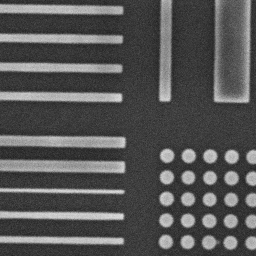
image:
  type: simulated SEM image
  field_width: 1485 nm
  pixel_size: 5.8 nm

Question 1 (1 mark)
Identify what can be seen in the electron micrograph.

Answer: groups of lines, slits or small figures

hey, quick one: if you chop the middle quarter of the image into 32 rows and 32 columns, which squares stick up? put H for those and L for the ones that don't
HHHHHHHHHHHHHHLLLLLLLLLLHHHLLLLL
HHHHHHHHHHHHHHLLLLLLLLLLHHHLLLLL
LLLLLLLLLLLLLLLLLLLLLLLLHHHLLLLL
LLLLLLLLLLLLLLLLLLLLLLLLHHLLLLLL
LLLLLLLLLLLLLLLLLLLLLLLLHHLLLLLL
LLLLLLLLLLLLLLLLLLLLLLLLHHLLLLLL
LLLLLLLLLLLLLLLLLLLLLLLLHHLLLLLL
HHHHHHHHHHHHHHLLLLLLLLLLHHLLLLLL
HHHHHHHHHHHHHHLLLLLLLLLLHHLLLLLL
LLLLLLLLLLLLLLLLLLLLLLLLLLLLLLLL
LLLLLLLLLLLLLLLLLLLLLLLLLLLLLLLL
LLLLLLLLLLLLLLLLLLLLLLLLLLLLLLLL
LLLLLLLLLLLLLLLLLLLLLLLLLLLLLLLL
LLLLLLLLLLLLLLLLLLLLLLLLLLLLLLLL
LLLLLLLLLLLLLLLLLLLLLLLLLLLLLLLL
LLLLLLLLLLLLLLLLLLLLLLLLLLLLLLLL
LLLLLLLLLLLLLLLLLLLLLLLLLLLLLLLL
LLLLLLLLLLLLLLLLLLLLLLLLLLLLLLLL
HHHHHHHHHHHHHHHLLLLLLLLLLLLLLLLL
HHHHHHHHHHHHHHHLLLLLLLLLLLLLLLLL
HHHHHHHHHHHHHHHLLLLLLLLLLLLLLLLL
LLLLLLLLLLLLLLLLLLLLLLLLLHHLLLLH
LLLLLLLLLLLLLLLLLLLLLLLLHHHLLLHH
LLLLLLLLLLLLLLLLLLLLLLLLHHHLLLHH
HHHHHHHHHHHHHHHLLLLLLLLLLLLLLLLH
HHHHHHHHHHHHHHHLLLLLLLLLLLLLLLLL
HHHHHHHHHHHHHHHLLLLLLLLLLLLLLLLL
LLLLLLLLLLLLLLLLLLLLLLLLHHHLLLHH
LLLLLLLLLLLLLLLLLLLLLLLLHHHLLLHH
LLLLLLLLLLLLLLLLLLLLLLLLLHHLLLHH
LLLLLLLLLLLLLLLLLLLLLLLLLLLLLLLL
LLLLLLLLLLLLLLLLLLLLLLLLLLLLLLLL